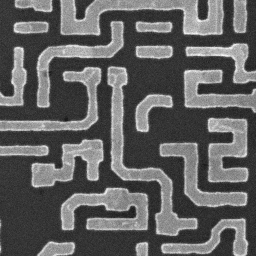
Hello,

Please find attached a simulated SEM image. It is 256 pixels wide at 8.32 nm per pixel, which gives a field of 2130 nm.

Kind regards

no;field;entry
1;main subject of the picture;wiring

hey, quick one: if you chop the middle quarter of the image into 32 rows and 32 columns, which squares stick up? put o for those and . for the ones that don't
................................
.....oooo..oooo.................
ooooooooo..ooooo..............oo
ooooooooo..ooooo..............oo
....ooooo..ooooo..............oo
......oo....oo................oo
......oo....oo................oo
......oo....oo................oo
......oo....ooo......oooooo...oo
......oo....oo......ooooooo...oo
......oo....ooo...ooooo..oo....o
......oo....ooo...ooo...........
......oo....ooo...ooo...........
.....ooo....oo....ooo...........
.ooooooo....oo....ooo...........
ooooooo.....oo....ooo...........
...o........oo....ooo...........
............oo..................
............ooo.................
....oooooo..ooo.................
oooooooooo..ooo.........oooooooo
oooooooooo..oo..........oooooooo
oooooooooo..oo..........oooooooo
ooo..ooooo..oo................oo
ooo...ooo...oo................oo
ooo...ooo...ooo...............oo
oo....oo....oooooo.ooooo......oo
oo....oo.....oooooooooooo.....oo
oo....oo......oooooooooooo....oo
........................ooo...oo
........................ooo...oo
...........ooooo........ooo...oo